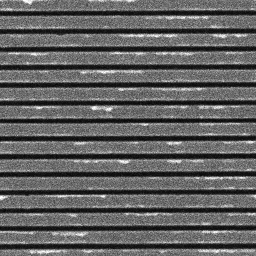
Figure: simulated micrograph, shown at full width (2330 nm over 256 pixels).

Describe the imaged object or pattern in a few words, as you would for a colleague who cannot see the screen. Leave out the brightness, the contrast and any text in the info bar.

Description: parallel lines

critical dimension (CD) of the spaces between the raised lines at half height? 45.5 nm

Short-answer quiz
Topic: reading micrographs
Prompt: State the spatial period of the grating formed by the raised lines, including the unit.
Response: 163 nanometers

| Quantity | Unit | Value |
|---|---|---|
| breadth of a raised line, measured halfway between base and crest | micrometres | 0.117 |